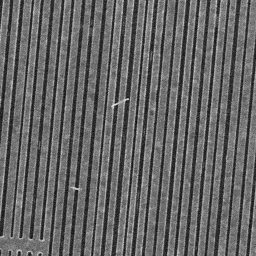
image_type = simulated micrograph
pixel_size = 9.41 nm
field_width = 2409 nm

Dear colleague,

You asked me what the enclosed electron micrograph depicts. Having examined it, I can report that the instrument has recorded parallel lines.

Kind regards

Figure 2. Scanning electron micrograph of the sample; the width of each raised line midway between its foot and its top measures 60.9 nanometres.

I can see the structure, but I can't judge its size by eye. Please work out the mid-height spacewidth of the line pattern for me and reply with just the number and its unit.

37.5 nanometres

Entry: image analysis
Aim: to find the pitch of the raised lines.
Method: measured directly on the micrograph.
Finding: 96.9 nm